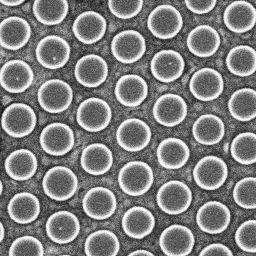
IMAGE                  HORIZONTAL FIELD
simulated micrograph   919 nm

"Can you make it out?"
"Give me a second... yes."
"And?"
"a regular array of raised bodies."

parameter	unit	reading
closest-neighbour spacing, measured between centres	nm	155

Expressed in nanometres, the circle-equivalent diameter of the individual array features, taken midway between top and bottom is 113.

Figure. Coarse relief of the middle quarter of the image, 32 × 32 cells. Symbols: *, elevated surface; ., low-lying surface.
...********...........********..
...********...........*******...
...********............******...
...*******.....****....*****....
....*****.....******............
*............*******............
**...........********...........
**...........*******............
**............******....*****...
**...*****....*****....*******..
*...*******............*******..
....*******............*******..
...********............*******..
...********............*******..
....*******....****.....*****...
.....*****....*******...........
**....***.....*******...........
**...........********...........
**...........********...........
**............*******....****...
**.....***.....*****....******..
*....******.....**......*******.
.....*******............*******.
.....*******............*******.
.....*******............******..
.....******.....*****....****...
*....******...********..........
**............********..........
***...........********..........
***...........********.....*....
***...........*******....*****..
***....****....******...*******.